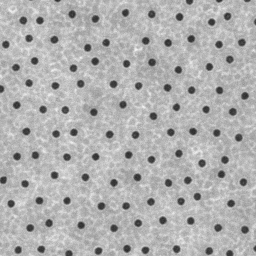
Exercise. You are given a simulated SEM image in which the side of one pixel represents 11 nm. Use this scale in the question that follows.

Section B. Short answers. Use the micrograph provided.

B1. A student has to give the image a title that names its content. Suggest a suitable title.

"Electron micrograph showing a regular array of holes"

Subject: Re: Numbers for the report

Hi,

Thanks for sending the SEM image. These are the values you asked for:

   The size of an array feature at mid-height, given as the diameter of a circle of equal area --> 94.7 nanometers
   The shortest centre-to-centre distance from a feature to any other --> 246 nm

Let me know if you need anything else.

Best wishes